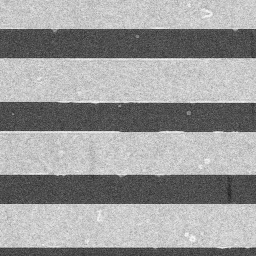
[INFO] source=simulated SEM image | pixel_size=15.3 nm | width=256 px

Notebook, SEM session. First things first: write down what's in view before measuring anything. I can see lines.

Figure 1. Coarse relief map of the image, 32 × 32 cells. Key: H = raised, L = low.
HHHHHHHHHHHHHHHHHHHHHHHHHHHHHHHH
HHHHHHHHHHHHHHHHHHHHHHHHHHHHHHHH
HHHHHHHHHHHHHHHHHHHHHHHHHHHHHHHH
HHHHHHHHHHHHHHHHHHHHHHHHHHHHHHHH
LLLLLLLLLLLLLLLLLLLLLLLLLLLLLLLL
LLLLLLLLLLLLLLLLLLLLLLLLLLLLLLLL
LLLLLLLLLLLLLLLLLLLLLLLLLLLLLLLL
HHHHHHHHHHHHHHHHHHHHHHHHHHHHHHHH
HHHHHHHHHHHHHHHHHHHHHHHHHHHHHHHH
HHHHHHHHHHHHHHHHHHHHHHHHHHHHHHHH
HHHHHHHHHHHHHHHHHHHHHHHHHHHHHHHH
HHHHHHHHHHHHHHHHHHHHHHHHHHHHHHHH
HHHHHHHHHHHHHHHHHHHHHHHHHHHHHHHH
LLLLLLLLLLLLLLLLLLLLLLLLLLLLLLLL
LLLLLLLLLLLLLLLLLLLLLLLLLLLLLLLL
LLLLLLLLLLLLLLLLLLLLLLLLLLLLLLLL
LLLLLLLLLLLLLLLLLLLLLLLLLLLLLLLL
HHHHHHHHHHHHHHHHHHHHHHHHHHHHHHHH
HHHHHHHHHHHHHHHHHHHHHHHHHHHHHHHH
HHHHHHHHHHHHHHHHHHHHHHHHHHHHHHHH
HHHHHHHHHHHHHHHHHHHHHHHHHHHHHHHH
HHHHHHHHHHHHHHHHHHHHHHHHHHHHHHHH
LLLLLLLLLLLLLLLLLLLLLLLLLLLLLLLL
LLLLLLLLLLLLLLLLLLLLLLLLLLLLLLLL
LLLLLLLLLLLLLLLLLLLLLLLLLLLLLLLL
LLLLLLLLLLLLLLLLLLLLLLLLLLLLLLLL
HHHHHHHHHHHHHHHHHHHHHHHHHHHHHHHH
HHHHHHHHHHHHHHHHHHHHHHHHHHHHHHHH
HHHHHHHHHHHHHHHHHHHHHHHHHHHHHHHH
HHHHHHHHHHHHHHHHHHHHHHHHHHHHHHHH
HHHHHHHHHHHHHHHHHHHHHHHHHHHHHHHH
LLLLLLLLLLLLLLLLLLLLLLLLLLLLLLLL